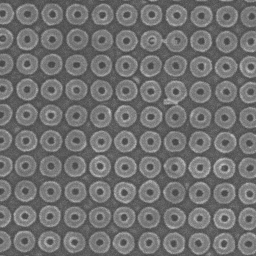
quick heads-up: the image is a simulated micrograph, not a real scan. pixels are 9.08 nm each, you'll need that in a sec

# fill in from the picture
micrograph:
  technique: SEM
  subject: a regular array of ring-shaped raised bodies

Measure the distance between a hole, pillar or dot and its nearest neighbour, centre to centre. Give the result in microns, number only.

0.223